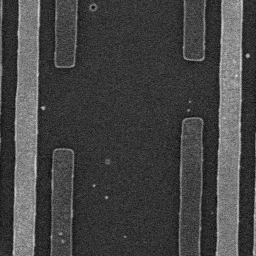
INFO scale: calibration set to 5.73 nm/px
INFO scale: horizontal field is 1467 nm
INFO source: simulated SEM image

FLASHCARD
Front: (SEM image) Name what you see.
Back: groups of lines, slits or small figures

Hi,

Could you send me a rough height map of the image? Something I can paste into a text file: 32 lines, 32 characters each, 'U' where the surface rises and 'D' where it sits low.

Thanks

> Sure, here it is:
DDUUUDDUUUDDDDDDDDDDDDDUUUDDUUDD
DDUUUDDUUUDDDDDDDDDDDDDUUUDDUUDD
DDUUUDDUUUDDDDDDDDDDDDDUUDDDUUDD
DDUUUDDUUUDDDDDDDDDDDDDUUUDDUUDD
DDUUUDDUUUDDDDDDDDDDDDDUUUDDUUDD
DDUUUDDUUDDDDDDDDDDDDDDUUDDDUUDD
DDUUUDDUUDDDDDDDDDDDDDDUUDDDUUDD
DDUUUDDUUDDDDDDDDDDDDDDDDDDDUUDD
DDUUUDDDDDDDDDDDDDDDDDDDDDDUUUDD
DDUUUDDDDDDDDDDDDDDDDDDDDDDUUUDD
DDUUUDDDDDDDDDDDDDDDDDDDDDDUUUDD
DDUUUDDDDDDDDDDDDDDDDDDDDDDDUUDD
DDUUUDDDDDDDDDDDDDDDDDDDDDDDUUDD
DDUUUDDDDDDDDDDDDDDDDDDDDDDUUUDD
DDUUUDDDDDDDDDDDDDDDDDDDDDDUUUDD
DDUUUDDDDDDDDDDDDDDDDDDUUDDUUUDD
DDUUUDDDDDDDDDDDDDDDDDDUUDDUUUDD
DDUUUDDDDDDDDDDDDDDDDDDUUDDUUUDD
DDUUUDDDDDDDDDDDDDDDDDDUUDDUUUDD
DDUUDDDUUDDDDDDDDDDDDDDUUDDUUUDD
DDUUDDDUUDDDDDDDDDDDDDDUUDDUUUDD
DDUUDDDUUDDDDDDDDDDDDDDUUDDUUUDD
DDUUDDDUUDDDDDDDDDDDDDDUUDDUUUDD
DDUUDDDUUDDDDDDDDDDDDDDUUDDUUUDD
DDUUDDDUUDDDDDDDDDDDDDDUUDDUUUDD
DDUUDDDUUDDDDDDDDDDDDDDUUDDUUUDD
DDUUDDDUUDDDDDDDDDDDDDDUUDDUUUDD
DDUUDDDUUDDDDDDDDDDDDDDUUDDUUUDD
DDUUDDUUUDDDDDDDDDDDDDUUUDDUUUDD
DDUUDDUUUDDDDDDDDDDDDDUUUDDUUUDD
DDUUDDUUUDDDDDDDDDDDDDUUUDDUUUDD
DDUUDDUUUDDDDDDDDDDDDDDUUDDUUUDD